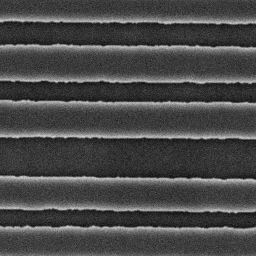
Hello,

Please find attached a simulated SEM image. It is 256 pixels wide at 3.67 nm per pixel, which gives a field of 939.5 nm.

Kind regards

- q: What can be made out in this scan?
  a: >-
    lines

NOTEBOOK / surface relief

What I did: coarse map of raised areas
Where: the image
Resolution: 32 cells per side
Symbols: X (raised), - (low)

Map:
XXXXXXXXXXXXXXXXXXXXXXXXXXXXXXXX
XXXXXXXXXXXXXXXXXXXXXXXXXXXXXXXX
XXXXXXXXXXXXXXXXXXXXXXXXXXXXXXXX
--------------------------------
--------------------------------
--------------------------------
XXXXXXXXXXXXXXXXXXXXXXXXXXXXXXXX
XXXXXXXXXXXXXXXXXXXXXXXXXXXXXXXX
XXXXXXXXXXXXXXXXXXXXXXXXXXXXXXXX
XXXXXXXXXXXXXXXXXXXXXXXXXXXXXXXX
--------------------------------
--------------------------------
--------------------------------
XXXXXXXXXXXXXXXXXXXXXXXXXXXXXXXX
XXXXXXXXXXXXXXXXXXXXXXXXXXXXXXXX
XXXXXXXXXXXXXXXXXXXXXXXXXXXXXXXX
XXXXXXXXXXXXXXXXXXXXXXXXXXXXXXXX
--------------------------------
--------------------------------
--------------------------------
--------------------------------
--------------------------------
XXXXXXXXXXXXXXXXXXXXXXXXXXXXXXXX
XXXXXXXXXXXXXXXXXXXXXXXXXXXXXXXX
XXXXXXXXXXXXXXXXXXXXXXXXXXXXXXXX
XXXXXXXXXXXXXXXXXXXXXXXXXXXXXXXX
----------------------------XX--
--------------------------------
XXXXXXXXXX-XXXXX-XXX----X---X---
XXXXXXXXXXXXXXXXXXXXXXXXXXXXXXXX
XXXXXXXXXXXXXXXXXXXXXXXXXXXXXXXX
XXXXXXXXXXXXXXXXXXXXXXXXXXXXXXXX